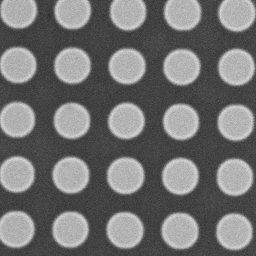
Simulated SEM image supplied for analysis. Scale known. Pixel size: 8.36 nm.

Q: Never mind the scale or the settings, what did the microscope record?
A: an array of small figures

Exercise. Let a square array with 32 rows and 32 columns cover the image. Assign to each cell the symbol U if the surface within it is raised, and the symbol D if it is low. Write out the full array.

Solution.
UUUUDDDUUUUDDDUUUUDDDUUUUDDDUUUD
UUUUDDDUUUUDDDUUUUDDDUUUUDDUUUUU
DUUUDDDUUUUDDDUUUUDDDUUUUDDDUUUU
DDDDDDDDDDDDDDDUUDDDDDUUDDDDDUUD
DDDDDDDDDDDDDDDDDDDDDDDDDDDDDDDD
DDDDDDDDDDDDDDDDDDDDDDDDDDDDDDDD
DUUUDDDDUUDDDDDUUDDDDDUUDDDDDUUD
UUUUDDDUUUUDDDUUUUDDDUUUUDDDUUUU
UUUUDDDUUUUDDDUUUUDDDUUUUDDUUUUU
DUUUDDDUUUUDDDUUUUDDDUUUUDDDUUUD
DDDDDDDDDDDDDDDDDDDDDDDDDDDDDUDD
DDDDDDDDDDDDDDDDDDDDDDDDDDDDDDDD
DDDDDDDDDDDDDDDDDDDDDDDDDDDDDDDD
DUUUDDDDUUDDDDUUUDDDDUUUDDDDUUUD
UUUUDDDUUUUDDDUUUUDDDUUUUDDDUUUD
UUUUDDDUUUUDDDUUUUDDDUUUUDDUUUUU
DUUUDDDUUUUDDDUUUDDDDUUUDDDDUUUD
DDDDDDDDDDDDDDDDDDDDDDDDDDDDDDDD
DDDDDDDDDDDDDDDDDDDDDDDDDDDDDDDD
DDDDDDDDDDDDDDDDDDDDDDDDDDDDDDDD
UUUUDDDUUUUDDDUUUDDDDUUUDDDDUUUD
UUUUDDDUUUUDDDUUUUDDUUUUUDDUUUUD
UUUUDDDUUUUDDDUUUUDDUUUUUDDUUUUD
DUUDDDDUUUDDDDUUUDDDDUUUDDDDUUUD
DDDDDDDDDDDDDDDDDDDDDDDDDDDDDDDD
DDDDDDDDDDDDDDDDDDDDDDDDDDDDDDDD
DDDDDDDDDDDDDDDDDDDDDDDDDDDDDDDD
UUUUDDDUUUUDDDUUUDDDDUUUDDDDUUUD
UUUUDDDUUUUDDUUUUUDDUUUUUDDUUUUD
UUUUDDDUUUUDDDUUUUDDUUUUUDDUUUUD
DUUDDDDDUUDDDDUUUDDDDUUUDDDDUUUD
DDDDDDDDDDDDDDDDDDDDDDDDDDDDDDDD